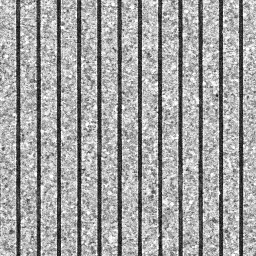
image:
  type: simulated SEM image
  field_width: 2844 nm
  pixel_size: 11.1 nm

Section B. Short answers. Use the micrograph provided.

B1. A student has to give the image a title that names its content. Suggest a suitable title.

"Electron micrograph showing parallel lines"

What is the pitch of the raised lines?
20.2 px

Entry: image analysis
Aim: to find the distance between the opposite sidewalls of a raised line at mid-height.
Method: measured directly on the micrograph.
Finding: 174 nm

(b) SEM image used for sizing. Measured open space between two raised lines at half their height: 54.1 nanometers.